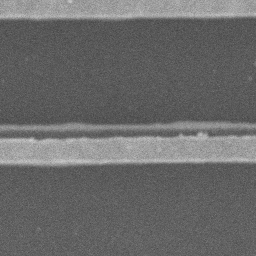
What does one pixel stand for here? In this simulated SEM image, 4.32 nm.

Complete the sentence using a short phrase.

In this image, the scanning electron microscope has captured lines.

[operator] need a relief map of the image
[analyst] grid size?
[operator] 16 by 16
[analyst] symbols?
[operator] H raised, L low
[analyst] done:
HHHHHHHHHHHHHHHH
LLLLLLLLLLLLLLLL
LLLLLLLLLLLLLLLL
LLLLLLLLLLLLLLLL
LLLLLLLLLLLLLLLL
LLLLLLLLLLLLLLLL
LLLLLLLLLLLLLLLL
LLLLLLLLLLLLLLLL
HHHHHHHHHHHHHHHH
HHHHHHHHHHHHHHHH
LLLLLLLLLLLLLLLL
LLLLLLLLLLLLLLLL
LLLLLLLLLLLLLLLL
LLLLLLLLLLLLLLLL
LLLLLLLLLLLLLLLL
LLLLLLLLLLLLLLLL